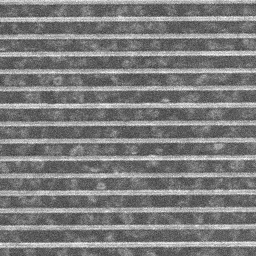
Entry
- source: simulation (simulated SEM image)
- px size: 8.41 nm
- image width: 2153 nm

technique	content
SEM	parallel lines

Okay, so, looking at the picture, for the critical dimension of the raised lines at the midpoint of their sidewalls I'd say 28.4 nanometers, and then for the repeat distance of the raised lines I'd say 0.146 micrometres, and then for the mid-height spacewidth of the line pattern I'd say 118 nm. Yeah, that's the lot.